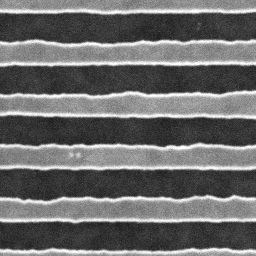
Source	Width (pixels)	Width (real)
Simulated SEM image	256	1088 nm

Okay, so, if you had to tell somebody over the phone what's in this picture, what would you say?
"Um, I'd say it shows lines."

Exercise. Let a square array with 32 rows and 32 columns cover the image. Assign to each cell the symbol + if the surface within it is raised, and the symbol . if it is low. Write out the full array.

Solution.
++++++++++++++++++++++++++++++++
.+++++++...++++++++++++++..++++.
................................
................................
................................
++++++++..++..++++++++++++++++++
++++++++++++++++++++++++++++++++
++++++++++++++++++++++++++++++++
................................
................................
................................
..............................++
++++++++++++++++++++++++++++++++
++++++++++++++++++++++++++++++++
.....+++++++++++++++++++++++++++
................................
................................
................................
++++++++++++++++++++++++++++++++
++++++++++++++++++++++++++++++++
++++++++++++++++++++++++++++++++
................................
................................
................................
.............................+..
++++++++++++++++++++++++++++++++
++++++++++++++++++++++++++++++++
++++++++++++++++++++++++++++++++
................................
................................
................................
++++++++++++++++++++++++++++++++